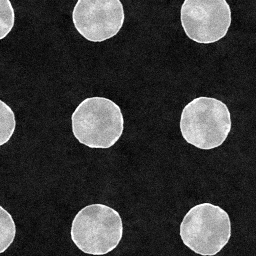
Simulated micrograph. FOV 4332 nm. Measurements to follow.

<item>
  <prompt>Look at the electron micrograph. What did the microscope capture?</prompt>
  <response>raised bodies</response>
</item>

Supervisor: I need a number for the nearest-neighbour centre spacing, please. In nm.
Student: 1800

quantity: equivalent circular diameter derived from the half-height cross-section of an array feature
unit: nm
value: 855